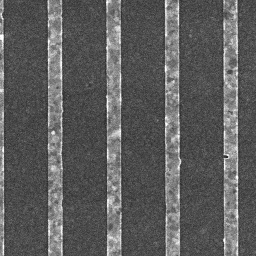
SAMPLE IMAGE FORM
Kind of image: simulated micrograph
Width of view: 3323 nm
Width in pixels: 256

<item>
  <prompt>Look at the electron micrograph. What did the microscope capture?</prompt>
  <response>parallel lines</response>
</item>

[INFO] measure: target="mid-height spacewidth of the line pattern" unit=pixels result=44.8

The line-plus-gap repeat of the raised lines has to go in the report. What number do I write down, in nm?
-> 760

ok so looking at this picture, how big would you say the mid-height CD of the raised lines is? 174 nanometers